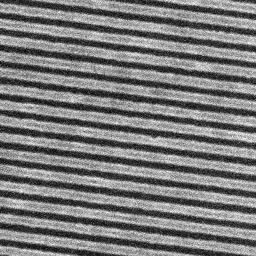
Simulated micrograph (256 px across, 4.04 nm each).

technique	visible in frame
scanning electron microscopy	parallel lines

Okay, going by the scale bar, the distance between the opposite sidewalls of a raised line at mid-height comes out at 33.5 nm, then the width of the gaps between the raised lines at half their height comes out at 8.29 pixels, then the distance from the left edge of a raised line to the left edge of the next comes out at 0.0648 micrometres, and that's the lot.